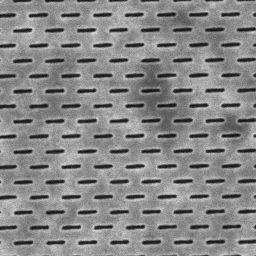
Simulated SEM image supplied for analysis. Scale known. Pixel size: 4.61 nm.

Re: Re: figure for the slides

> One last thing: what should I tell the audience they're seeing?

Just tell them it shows a regular array of holes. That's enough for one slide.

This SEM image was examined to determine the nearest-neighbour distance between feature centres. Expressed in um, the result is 0.1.